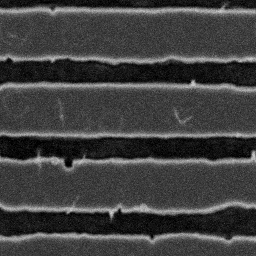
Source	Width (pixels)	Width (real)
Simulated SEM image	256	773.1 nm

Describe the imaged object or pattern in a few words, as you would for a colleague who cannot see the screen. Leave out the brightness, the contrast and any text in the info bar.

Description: one or a few lines or trenches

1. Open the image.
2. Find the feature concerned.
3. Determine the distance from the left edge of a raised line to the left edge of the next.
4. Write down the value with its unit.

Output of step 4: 0.226 micrometres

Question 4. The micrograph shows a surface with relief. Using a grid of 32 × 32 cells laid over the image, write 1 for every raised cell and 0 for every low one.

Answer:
00000000000000000000000000000000
11111111111111111111111111111111
11111111111111111111111111111111
11111111111111111111111111111111
11111111111111111111111111111111
11111111111111111111111111111111
11111111111111111111111111111111
00111110011011111111100111111111
00000000000000000000000000000000
00000000000000000000000000000000
01000111000000000000000010000000
11111111111111111111111111111111
11111111111111111111111111111111
11111111111111111111111111111111
11111111111111111111111111111111
11111111111111111111111111111111
11111111111111111111111111111111
00000000000000000000000000000000
00000000000000000000000000000000
00000000000000000000000000000001
11111111011111111111111111111111
11111111111111111111111111111111
11111111111111111111111111111111
11111111111111111111111111111111
11111111111111111111111111111111
11111111111111111111111111111111
00000000000001010001111111000000
00000000000000000000000000000000
00000000000000000000000000000000
00001111111111111100111111000000
11111111111111111111111111111111
11111111111111111111111111111111